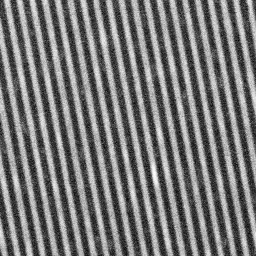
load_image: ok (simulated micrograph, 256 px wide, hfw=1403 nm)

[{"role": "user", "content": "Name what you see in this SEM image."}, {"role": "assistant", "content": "parallel lines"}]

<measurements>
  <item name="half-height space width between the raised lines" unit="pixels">7.74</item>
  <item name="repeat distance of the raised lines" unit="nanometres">68.5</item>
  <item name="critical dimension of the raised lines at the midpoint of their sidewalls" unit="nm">24.9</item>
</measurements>